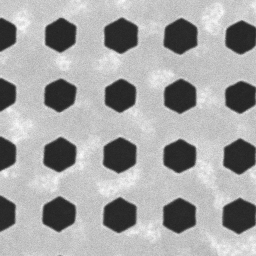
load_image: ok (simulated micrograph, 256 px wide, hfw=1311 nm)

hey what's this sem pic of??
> a regular array of holes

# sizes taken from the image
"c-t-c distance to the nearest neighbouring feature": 305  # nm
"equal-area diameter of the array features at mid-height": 172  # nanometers